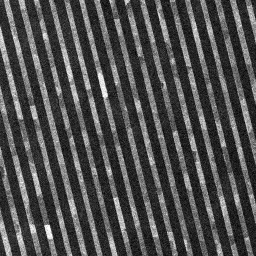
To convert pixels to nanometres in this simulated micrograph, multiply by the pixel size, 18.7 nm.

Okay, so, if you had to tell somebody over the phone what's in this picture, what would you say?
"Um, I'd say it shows parallel lines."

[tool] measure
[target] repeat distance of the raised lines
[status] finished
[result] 274 nm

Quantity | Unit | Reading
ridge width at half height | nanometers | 88.3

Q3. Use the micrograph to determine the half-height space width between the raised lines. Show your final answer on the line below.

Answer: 183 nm